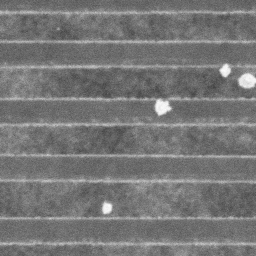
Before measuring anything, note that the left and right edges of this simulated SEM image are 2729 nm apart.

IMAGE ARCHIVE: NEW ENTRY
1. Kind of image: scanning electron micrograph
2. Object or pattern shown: lines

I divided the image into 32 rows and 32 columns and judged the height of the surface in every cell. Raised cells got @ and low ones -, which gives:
@@@@@@@@@@@@@@@@@@@@@@@@@@@@@@@@
@@@@@@@@@@@@@@@@@@@@@@@@@@@@@@@@
--------------------------------
--------------------------------
--------------------------------
@@@@@@@@@@@@@@@@@@@@@@@@@@@@@@@@
@@@@@@@@@@@@@@@@@@@@@@@@@@@@@@@@
@@@@@@@@@@@@@@@@@@@@@@@@@@@@@@@@
---------------------------@@---
--------------------------------
------------------------------@-
--------------------------------
@@@@@@@@@@@@@@@@@@@@@@@@@@@@@@@@
@@@@@@@@@@@@@@@@@@@@@@@@@@@@@@@@
@@@@@@@@@@@@@@@@@@@@@@@@@@@@@@@@
@@@@@@@@@@@@@@@@@@@@@@@@@@@@@@@@
--------------------------------
--------------------------------
--------------------------------
@@@@@@@@@@@@@@@@@@@@@@@@--------
@@@@@@@@@@@@@@@@@@@@@@@@@@@@@@@@
@@@@@@@@@@@@@@@@@@@@@@@@@@@@@@@@
@@@@@@@@@@@@@@@@@@@@@@@@@@@@@@@@
--------------------------------
--------------------------------
--------------------------------
--------------------------------
@@@@@@@@@@@@@@@@@@@@@@@@@@@@@@@@
@@@@@@@@@@@@@@@@@@@@@@@@@@@@@@@@
@@@@@@@@@@@@@@@@@@@@@@@@@@@@@@@@
@@@@@@@@@--@@@-@@@@@@@@@@@@@@@@@
--------------------------------